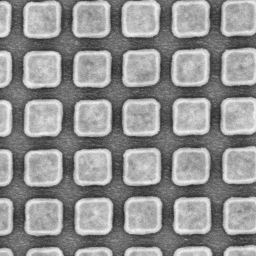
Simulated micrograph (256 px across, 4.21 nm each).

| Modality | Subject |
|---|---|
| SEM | a regular array of raised bodies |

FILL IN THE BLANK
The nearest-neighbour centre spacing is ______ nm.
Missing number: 205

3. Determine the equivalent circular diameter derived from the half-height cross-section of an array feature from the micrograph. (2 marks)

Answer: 160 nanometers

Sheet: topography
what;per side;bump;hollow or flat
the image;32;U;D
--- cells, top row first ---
UDDDUUUDDDUUUDDDUUUUDDUUUUDDUUUU
UDDUUUUDDUUUUUDUUUUUDDUUUUDDUUUU
UDDUUUUDDUUUUDDUUUUUDDUUUUDDUUUU
UDDUUUUDDUUUUDDUUUUUDDUUUUDDUUUU
DDDDUUDDDDUDDDDDDDDDDDDDDDDDDDDD
DDDDDDDDDDDDDDDDDDDDDDDDDDDDDDDD
DDDDDDDDDDDUUDDDUUUDDDUUUUDDUUUU
UDDUUUUDDUUUUUDDUUUUDDUUUUDDUUUU
UDDUUUUDDUUUUUDUUUUUDDUUUUDDUUUU
UDDUUUUDDUUUUUDDUUUUDDUUUUDDUUUU
UDDUUUUDDDUUUDDDUUUDDDUUUDDDDDDD
DDDDDDDDDDDDDDDDDDDDDDDDDDDDDDDD
DDDDDDDDDDDDDDDDDDDDDDDUUUDDDUUU
UDDUUUUUDUUUUUDDUUUUDDUUUUDDUUUU
UDDUUUUUDUUUUUDDUUUUDDUUUUDDUUUU
UDDUUUUUDUUUUUDUUUUUDDUUUUDDUUUU
UDDUUUUDDDUUUDDDUUUDDDUUUDDDUUUD
DDDDDDDDDDDDDDDDDDDDDDDDDDDDDDDD
DDDDDDDDDDDDDDDDDDDDDDDDDDDDDDDD
UDDUUUUUDDUUUUDDUUUUDDUUUUDDUUUU
UDDUUUUUDUUUUUDDUUUUDDUUUUDDUUUU
UDDUUUUDDUUUUUDDUUUUDDUUUUDDUUUU
UDDUUUUDDDUUUUDDUUUUDDUUUUDDUUUU
DDDDDDDDDDDDDDDDDDDDDDDDDDDDDDDD
DDDDDDDDDDDDDDDDDDDDDDDDDDDDDDDD
UDDDUUUUDDUUUUDDUUUUDDUUUUDDUUUU
UDDUUUUUDDUUUUDDUUUUDDUUUUDDUUUU
UDDUUUUUDDUUUUDDUUUUDDUUUUDDUUUU
UDDUUUUUDDUUUUDDUUUUDDUUUUDDUUUU
DDDDDDDDDDDDDDDDDDDDDDDDDDDDDDDD
DDDDDDDDDDDDDDDDDDDDDDDDDDDDDDDD
UDDDUUUDDDUUUUDDUUUUDDUUUUDDUUUU